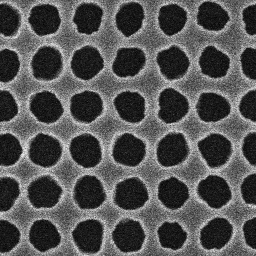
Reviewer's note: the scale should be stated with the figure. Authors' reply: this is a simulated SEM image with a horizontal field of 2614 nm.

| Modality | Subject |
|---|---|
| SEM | a regular array of holes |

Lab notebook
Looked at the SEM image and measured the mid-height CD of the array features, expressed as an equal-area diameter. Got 330 nanometers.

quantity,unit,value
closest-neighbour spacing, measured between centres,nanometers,424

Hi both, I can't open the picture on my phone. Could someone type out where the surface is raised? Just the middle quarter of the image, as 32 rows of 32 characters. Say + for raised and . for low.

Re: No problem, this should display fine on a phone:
++........++........++++.......+
++.......+++.......+++++.......+
++......+++++......++++++.....++
+++....+++++++++++++++++++...+++
++++++++++++++++++++++++++++++++
++++++++++++++++++++++++++++++++
+++++++++++++++++++++++++...++++
+++......+++++.....+++++.....+++
++.......++++.......++++......++
++........++........+++........+
++........+++.......++++.......+
++........+++.......++++.......+
++.......++++.......+++.......++
++......++++++......++++.....+++
+++++..++++++++++..++++++...++++
++++++++++++++++++++++++++++++++
++++++++++++++++++++++++++++++++
++++...++++++++..+++++++++....++
++......+++++.....+++++++.....++
++.......++++.......++++.......+
+........++++.......+++........+
+........+++........+++........+
++.......+++........+++........+
++.......+++........+++........+
+++......++++......+++++......++
++++....+++++++...++++++....++++
++++++++++++++++++++++++++++++++
++++++++++++++++++++++++++++++++
++++....++++++++...++++++++.++++
+++......+++++......++++......++
+++.......+++........+++.......+
++........+++........+++.......+